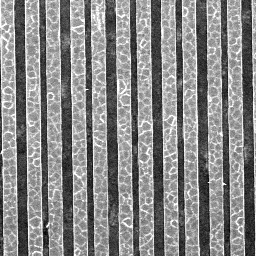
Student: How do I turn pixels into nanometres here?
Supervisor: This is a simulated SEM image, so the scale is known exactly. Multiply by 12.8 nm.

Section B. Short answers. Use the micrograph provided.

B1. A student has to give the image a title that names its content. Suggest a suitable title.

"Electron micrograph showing parallel lines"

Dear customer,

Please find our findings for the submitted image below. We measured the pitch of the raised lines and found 289 nm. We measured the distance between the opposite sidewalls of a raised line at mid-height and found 177 nm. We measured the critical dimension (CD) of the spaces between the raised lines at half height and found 136 nm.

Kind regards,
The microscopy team